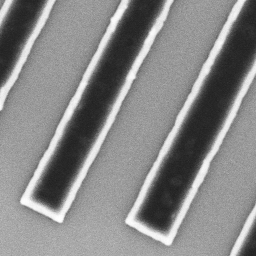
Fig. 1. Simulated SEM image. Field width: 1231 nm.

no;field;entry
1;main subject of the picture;one or a few lines or trenches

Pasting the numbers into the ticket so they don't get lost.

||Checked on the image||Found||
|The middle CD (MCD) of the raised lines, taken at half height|206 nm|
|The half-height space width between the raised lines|296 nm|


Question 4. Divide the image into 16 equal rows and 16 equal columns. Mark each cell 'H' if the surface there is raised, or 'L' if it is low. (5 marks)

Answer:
HHHLLLLLHHLLLLLH
HHHLLLLHHHLLLLHH
HHLLLLLHHLLLLLHH
HHLLLLHHHLLLLHHH
HLLLLHHHLLLLLHHH
LLLLLHHHLLLLHHHL
LLLLHHHLLLLLHHHL
LLLLHHHLLLLHHHLL
LLLLHHLLLLLHHHLL
LLLHHHLLLLHHHLLL
LLLHHLLLLLHHHLLL
LLHHHLLLLHHHLLLL
LLHHLLLLLHHHLLLL
LLLHLLLLHHHLLLLL
LLLLLLLLLHHLLLLH
LLLLLLLLLLLLLLLH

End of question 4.